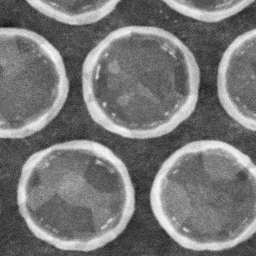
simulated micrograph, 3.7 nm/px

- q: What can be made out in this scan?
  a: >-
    raised bodies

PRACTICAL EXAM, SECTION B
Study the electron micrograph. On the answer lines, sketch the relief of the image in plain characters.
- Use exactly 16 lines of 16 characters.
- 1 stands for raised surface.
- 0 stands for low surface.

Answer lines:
0001111000011110
0000000000000000
1110000111100001
1110001111110011
1111001111110011
1111001111110011
1111001111110011
1110001111100001
0000000000000000
0001111000011110
0011111100111111
0111111100111111
0111111100111111
0011111100111111
0011111000011111
0000000000000000